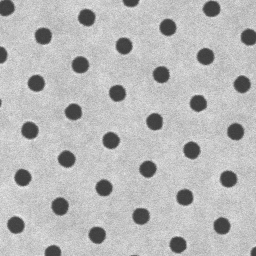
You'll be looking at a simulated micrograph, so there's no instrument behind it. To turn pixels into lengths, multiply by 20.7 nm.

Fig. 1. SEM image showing a regular array of holes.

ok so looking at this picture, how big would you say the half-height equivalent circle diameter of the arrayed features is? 0.371 um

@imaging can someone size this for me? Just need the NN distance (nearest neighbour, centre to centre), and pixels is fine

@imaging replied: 46.8